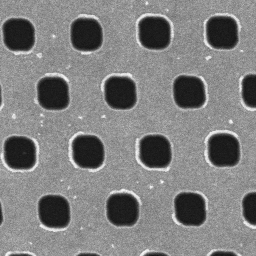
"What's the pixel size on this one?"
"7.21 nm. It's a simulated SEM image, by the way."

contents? a regular array of holes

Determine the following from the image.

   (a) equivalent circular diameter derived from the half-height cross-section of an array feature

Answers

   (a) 235 nm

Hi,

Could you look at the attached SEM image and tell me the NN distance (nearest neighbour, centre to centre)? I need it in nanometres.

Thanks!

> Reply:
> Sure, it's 487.